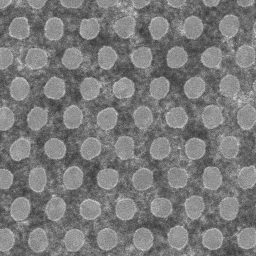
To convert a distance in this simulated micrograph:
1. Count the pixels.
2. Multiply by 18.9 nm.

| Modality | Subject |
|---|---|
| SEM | a regular array of raised bodies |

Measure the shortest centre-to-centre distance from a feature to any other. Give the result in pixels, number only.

34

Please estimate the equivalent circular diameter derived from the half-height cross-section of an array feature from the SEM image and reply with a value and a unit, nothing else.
0.388 um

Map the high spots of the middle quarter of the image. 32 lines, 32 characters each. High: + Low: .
++++.....+++......+++.....+++...
................................
................................
........................+.......
.....+++.....++++.....++++.....+
....+++++...+++++.....++++....++
....+++++...+++++.....++++....++
....++++.....++++.....+++......+
.....+++...............+........
................................
................................
.+++......+++.....+++......+++..
+++++....++++.....++++....++++..
+++++....++++....+++++....+++++.
++++.....++++.....++++....+++++.
.+++.....++++.....+++......+++..
......+.........................
................................
..............++........+.......
.....++++....++++.....++++.....+
....+++++....++++.....++++....++
....+++++....++++.....++++....++
....++++.....++++.....++++.....+
.....++.......++.......++.......
................................
................+...............
.+++......++....+..++......+++..
++++.....++++.....++++....+++++.
++++....+++++....+++++....+++++.
++++....+++++....+++++....+++++.
++++.....++++.....++++.....+++..
................................